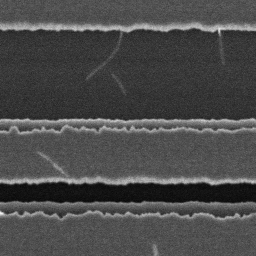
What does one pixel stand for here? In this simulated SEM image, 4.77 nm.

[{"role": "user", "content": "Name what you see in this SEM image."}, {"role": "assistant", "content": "lines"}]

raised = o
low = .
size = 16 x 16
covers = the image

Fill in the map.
oooooooooooooooo
oooooooooooooooo
................
................
................
................
................
oo..ooo..ooooo.o
oooooooooooooooo
oooooooooooooooo
oooooooooooooooo
.......o.....o..
................
oooooooooooooooo
oooooooooooooooo
oooooooooooooooo